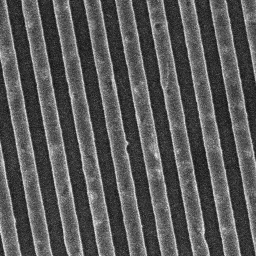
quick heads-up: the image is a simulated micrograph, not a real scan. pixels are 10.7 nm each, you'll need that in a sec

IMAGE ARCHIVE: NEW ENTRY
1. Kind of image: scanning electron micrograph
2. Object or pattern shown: parallel lines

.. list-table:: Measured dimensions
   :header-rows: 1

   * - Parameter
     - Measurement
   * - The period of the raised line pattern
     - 331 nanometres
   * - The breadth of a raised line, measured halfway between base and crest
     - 161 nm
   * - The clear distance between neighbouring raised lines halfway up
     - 170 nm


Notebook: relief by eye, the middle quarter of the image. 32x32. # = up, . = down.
####....####....####....####....
####....####....####....####....
.###....####....####....####....
.####....##......###....####....
.####....##.#....####...####....
.####....##.#....####....####...
.####....##.#....####....####...
..###....####....####....####...
..###.....###....####....####...
..####....###....####....####...
..####....####....####....####..
..####....####....####....####..
..####....####....####....####..
...###.....###....#.##....####..
...####....###....#.##....####..
...####....####....####....###..
...####....####....####....###..
...####....####....####....####.
....###....####....####....####.
....###.....####...####....####.
....####....####...####....####.
....####....###.....####....###.
....####....####....####....####
....####....####....####....####
#....##......###....####....####
#....####....###.....###....####
#....####....####....###.....###
#....####....####....####....###
#....####....####....####....###
#.....###....####....####....##.
.#....###....#####...####....##.
.#....####....####....###....##.